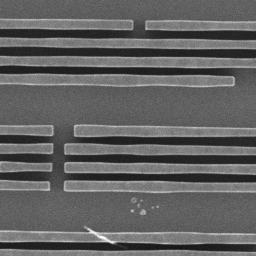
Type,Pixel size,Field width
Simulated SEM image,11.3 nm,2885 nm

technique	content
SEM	groups of lines, slits or small figures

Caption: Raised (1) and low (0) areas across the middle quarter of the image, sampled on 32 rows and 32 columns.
00000000111111111111111111111111
00000000000000000000000000000000
00000000000000000000000000000000
11111111111111111111111111111111
11111111111111111111111111111111
00000000000000110000000000000011
00000000000000000000000000000000
00000000000000000000000000000000
00000000000000000000000000000000
00000000000000000000000000000000
00000000000000000000000000000000
00000000000000000000000000000000
00000000000000000000000000000000
00000000000000000000000000000000
00000000000000000000000000000000
00011111100000000000000000000000
00011111111111111111111111111111
00011111111111111111111111111111
00000000000000000000000000000000
00000000000000000000000000000000
11111111111111111111111111111111
11111111111111111111111111111111
00001110000000000011111111111111
00000000000000000000000000000000
00000000000000000000000000000000
11111111111111111111111111111111
11111111111111111111111111111111
00000000000000000000000000000000
00000000000000000000000000000000
11111111111111111111111111000000
11111111111111111111111111111111
11111111111111111111111111111111